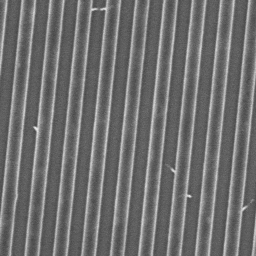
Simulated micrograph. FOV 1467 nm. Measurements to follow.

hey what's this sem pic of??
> parallel lines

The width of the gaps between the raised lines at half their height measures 84 nm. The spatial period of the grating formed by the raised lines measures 0.162 microns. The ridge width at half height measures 78.3 nanometers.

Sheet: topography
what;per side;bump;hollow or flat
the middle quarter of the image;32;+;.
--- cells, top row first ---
..+++....+++....+++....++++...++
..+++....+++....+++....++++...++
..+++....+++....+++....+++....++
..+++....+++....+++....+++....++
..+++....+++....+++....+++....++
..+++....+++....+++....+++....++
.++++....+++....+++....+++....++
.++++...++++....+++....+++....++
.+++....++++....+++....+++....++
.+++....+++.....+++...++++....++
.+++....+++....++++...++++...+++
.+++....+++....+++....++++...+++
.+++....+++....+++....+++....+++
.+++....+++....+++....+++....+++
.+++....+++....+++....+++....+++
.+++....+++....+++....+++....+++
++++....+++....+++....+++....+++
++++...++++....+++....+++....+++
+++....++++....+++....+++....+++
+++....+++....++++...++++....+++
+++....+++....++++...++++...++++
+++....+++....+++....++++...++++
+++....+++....+++....+++....++++
+++....+++....+++....+++....+++.
+++....+++....+++....+++....+++.
+++....+++....+++....+++....+++.
+++....+++....+++....+++...++++.
+++...++++....+++....+++....+++.
++....++++....+++....+++....+++.
++....++++....+++...++++....+++.
++....+++.....+++...++++....+++.
++....+++....+++....++++...++++.